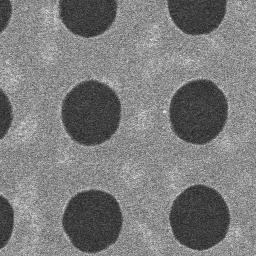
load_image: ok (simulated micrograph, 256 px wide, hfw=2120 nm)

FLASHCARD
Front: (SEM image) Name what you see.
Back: holes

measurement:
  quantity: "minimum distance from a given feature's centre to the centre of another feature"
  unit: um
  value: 0.881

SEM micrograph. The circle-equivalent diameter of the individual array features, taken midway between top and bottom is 516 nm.